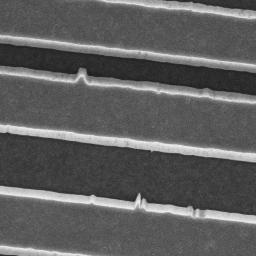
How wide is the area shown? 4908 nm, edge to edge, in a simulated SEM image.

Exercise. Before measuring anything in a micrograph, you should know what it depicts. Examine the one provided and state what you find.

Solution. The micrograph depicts one or a few lines or trenches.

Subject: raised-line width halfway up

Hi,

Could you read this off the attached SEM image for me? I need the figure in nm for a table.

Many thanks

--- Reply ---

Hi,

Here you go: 1110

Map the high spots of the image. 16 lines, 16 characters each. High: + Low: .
+++++++++++++...
++++++++++++++++
.+++++++++++++++
.........+++++++
++..............
++++++++++......
++++++++++++++++
++++++++++++++++
....++++++++++++
.............+++
................
................
++++++..........
++++++++++++++..
++++++++++++++++
++++++++++++++++